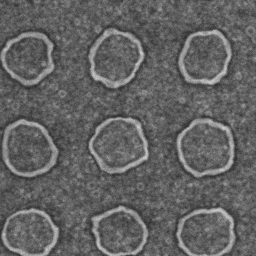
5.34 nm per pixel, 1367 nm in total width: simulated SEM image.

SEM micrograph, raised bodies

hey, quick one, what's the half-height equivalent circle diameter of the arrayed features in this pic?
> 51.6 px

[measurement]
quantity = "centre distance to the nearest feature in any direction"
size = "0.467 micrometres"